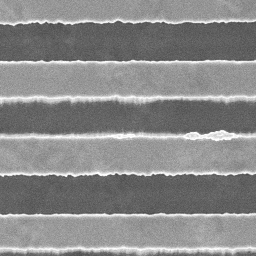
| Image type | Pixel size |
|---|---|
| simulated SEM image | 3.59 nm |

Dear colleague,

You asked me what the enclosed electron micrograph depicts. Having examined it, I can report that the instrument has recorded lines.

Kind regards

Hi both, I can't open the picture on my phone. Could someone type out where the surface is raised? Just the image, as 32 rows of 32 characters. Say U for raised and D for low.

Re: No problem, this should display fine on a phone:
UUUUUUUUUUUUUUUUUUUUUUUUUUUUUUUU
UUUUUUUUUUUUUUUUUUUUUUUUUUUUUUUU
UUUUUUUUUUUUUUUUUUUUUUUUUUUUUUUU
DDDDDDDDDDDDDDDDDDDDDDDDDDDDDDDD
DDDDDDDDDDDDDDDDDDDDDDDDDDDDDDDD
DDDDDDDDDDDDDDDDDDDDDDDDDDDDDDDD
DDDDDDDDDDDDDDDDDDDDDDDDDDDDDDDD
DDDDDDDDDDDDDDDDDDDDDDDDDDDDDDDD
UUUUUUUUUUUUUUUUUUUUUUUUUUUUUUUU
UUUUUUUUUUUUUUUUUUUUUUUUUUUUUUUU
UUUUUUUUUUUUUUUUUUUUUUUUUUUUUUUU
UUUUUUUUUUUUUUUUUUUUUUUUUUUUUUUU
DDDDDDDDDDDDDDDDDDDDDDDDDDDDDDDD
DDDDDDDDDDDDDDDDDDDDDDDDDDDDDDDD
DDDDDDDDDDDDDDDDDDDDDDDDDDDDDDDD
DDDDDDDDDDDDDDDDDDDDDDDDDDDDDDDD
DDDDDDDDDDDDDDDDDDDDDDDDDDDUDDDD
UUUUUUUUUUUUUUUUUUUUUUUUUUUUUUUU
UUUUUUUUUUUUUUUUUUUUUUUUUUUUUUUU
UUUUUUUUUUUUUUUUUUUUUUUUUUUUUUUU
UUUUUUUUUUUUUUUUUUUUUUUUUUUUUUUU
UUUUUUUUUUUUUUUUUUUUUUUUUUUUUUUU
DDDDDDDDDDDDDDDDDDDDDDDDDDDDDDDD
DDDDDDDDDDDDDDDDDDDDDDDDDDDDDDDD
DDDDDDDDDDDDDDDDDDDDDDDDDDDDDDDD
DDDDDDDDDDDDDDDDDDDDDDDDDDDDDDDD
DDDDDDDDDDDDDDDDDDDDDDDDDDDDDDDD
UUUUUUUUUUUUUUUUUUUUUUUUUUUUUUUU
UUUUUUUUUUUUUUUUUUUUUUUUUUUUUUUU
UUUUUUUUUUUUUUUUUUUUUUUUUUUUUUUU
UUUUUUUUUUUUUUUUUUUUUUUUUUUUUUUU
DDDDDDDDDDDDDDDDDDDDDDDDDDDDDDDD